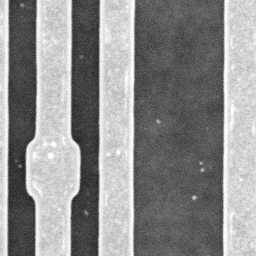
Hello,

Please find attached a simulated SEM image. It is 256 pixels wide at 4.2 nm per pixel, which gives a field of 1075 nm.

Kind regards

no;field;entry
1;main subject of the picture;wiring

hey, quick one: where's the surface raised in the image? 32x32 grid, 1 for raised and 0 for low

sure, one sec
10000111100001111000000000001111
10000111100001111000000000001111
10000111100001111000000000001111
10000111100001111000000000001111
10000111100001111000000000001111
10000111100001111000000000001111
10000111100001111000000000001111
10000111100001111000000000001111
10000111100001111000000000001111
10000111100001111000000000001111
10000111100001111000000000001111
10000111100001111000000000001111
10000111100001111000000000001111
10000111100001111000000000001111
10000111100001111000000000001111
10000111100001111000000000001111
10000111100001111000000000001111
10001111100001111000000000001111
10011111110001111000000000001111
10011111110001111000000000001111
10011111110001111000000000001111
10011111110001111000000000001111
10011111110001111000000000001111
10011111110001111000000000001111
10001111100001111000000000001111
10001111100001111000000000001111
10000111100001111000000000001111
10000111100001111000000000001111
10000111100001111000000000001111
10000111100011111000000000001111
10000111100011111000000000001111
10000111100011111000000000001111